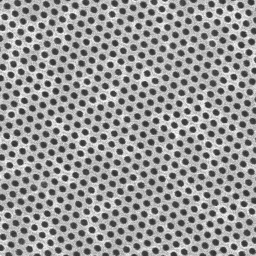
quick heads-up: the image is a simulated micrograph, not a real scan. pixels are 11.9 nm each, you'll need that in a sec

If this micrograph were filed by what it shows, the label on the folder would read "a regular array of holes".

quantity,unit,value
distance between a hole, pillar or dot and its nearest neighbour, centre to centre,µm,0.129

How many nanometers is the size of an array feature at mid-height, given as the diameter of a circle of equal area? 83.1